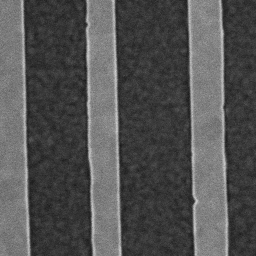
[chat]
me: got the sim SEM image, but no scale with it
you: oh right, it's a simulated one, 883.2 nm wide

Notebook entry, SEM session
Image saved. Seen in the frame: one or a few lines or trenches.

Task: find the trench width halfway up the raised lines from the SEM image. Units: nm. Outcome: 222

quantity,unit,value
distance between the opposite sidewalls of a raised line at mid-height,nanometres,105